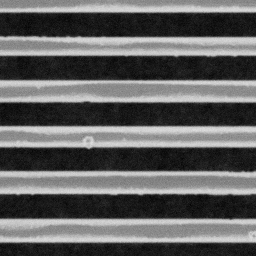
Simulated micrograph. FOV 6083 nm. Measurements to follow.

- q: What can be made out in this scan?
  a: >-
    lines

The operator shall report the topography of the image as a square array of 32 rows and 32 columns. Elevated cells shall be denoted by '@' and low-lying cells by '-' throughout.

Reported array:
@@@@@@@@@@@@@@@@@@@@@@@@@@@@@@@@
--------------------------------
--------------------------------
--------------------------------
--------------------------------
@@@@@@@@@@@@@@@@@@@@@@@@@@@@@@@@
@@@@@@@@@@@@@@@@@@@@@@@@@@@@@@@@
--------------------------------
--------------------------------
--------------------------------
@@@@@@@@@@@@@@@@@@@@@@@@@@@@@@@@
@@@@@@@@@@@@@@@@@@@@@@@@@@@@@@@@
@@@---------@@@@@@----------@@@@
--------------------------------
--------------------------------
--------------------------------
@@@@@@@@@@@@@@@@@@@@@@@@@@@@@@@@
@@@@@@@@@@@@@@@@@@@@@@@@@@@@@@@@
--------------------------------
--------------------------------
--------------------------------
--------------------------------
@@@@@@@@@@@@@@@@@@@@@@@@@@@@@@@@
@@@@@@@@@@@@@@@@@@@@@@@@@@@@@@@@
--------------------------------
--------------------------------
--------------------------------
--------------------------------
@@@@@@@@@@@@@@@@@@@@@@@@@@@@@@@@
@@@@@@@@@@@@@@@@@@@@@@@@@@@@@@@@
--------------------------------
--------------------------------